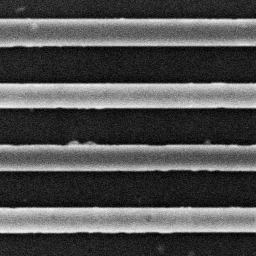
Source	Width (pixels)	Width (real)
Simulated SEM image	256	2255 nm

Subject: lines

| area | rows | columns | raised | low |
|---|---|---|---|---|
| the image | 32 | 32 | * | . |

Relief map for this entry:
................................
................................
********************************
********************************
********************************
********************************
................................
................................
................................
................................
.......................*..***...
********************************
********************************
.........****...................
................................
................................
................................
................................
********************************
********************************
********************************
................................
................................
................................
................................
................................
********************************
********************************
********************************
................................
................................
................................